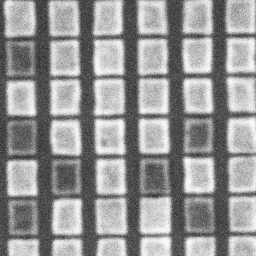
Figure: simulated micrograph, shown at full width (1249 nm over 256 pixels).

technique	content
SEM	wiring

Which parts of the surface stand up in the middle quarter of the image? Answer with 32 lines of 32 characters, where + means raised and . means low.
++++....++++++.....++++++......+
++++....++++++.....++++++......+
..+.............................
................................
++++....+++++++....+++++++.....+
++++....+++++++....+++++++.....+
++++....+++++++....+++++++.....+
++++....+++++++....+++++++.....+
++++....+++++++....++++++......+
+++.....+++++++....++++++......+
+++.....+++++++....++++++......+
+++.....+++++++....++++++.......
................................
................................
.............+.....++++++......+
+++.....++++++.....++++++......+
+++.....++++++.....++++++......+
++++....++++++.....++++++......+
++++....++++++.....++++++......+
++++....+++++++....+++++++.....+
++++....+++++++....+++++++....++
++++.....++++++....+++++++....++
...+............................
................................
++++.....++++++....+++++++.....+
++++.....++++++....+++++++.....+
++++.....++++++....++++++......+
++++.....++++++....+++++++.....+
++++.....++++++....+++++++.....+
++++.....++++++....+++++++.....+
++++.....++++++....+++++++.....+
++++.....++++++....+++++++.....+